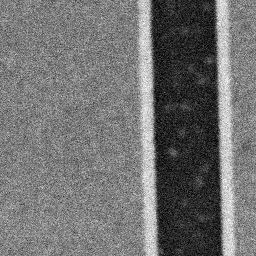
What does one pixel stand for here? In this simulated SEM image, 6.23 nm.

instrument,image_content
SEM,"one or a few lines or trenches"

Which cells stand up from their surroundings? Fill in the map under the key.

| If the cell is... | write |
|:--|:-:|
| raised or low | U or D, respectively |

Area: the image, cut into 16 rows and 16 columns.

UUUUUUUUUDDDDDUU
UUUUUUUUUDDDDDUU
UUUUUUUUUDDDDDUU
UUUUUUUUUDDDDDUU
UUUUUUUUUDDDDDUU
UUUUUUUUUDDDDDUU
UUUUUUUUUDDDDDUU
UUUUUUUUUDDDDDUU
UUUUUUUUUDDDDDUU
UUUUUUUUUDDDDDUU
UUUUUUUUUDDDDDUU
UUUUUUUUUDDDDDUU
UUUUUUUUUDDDDDUU
UUUUUUUUUDDDDDUU
UUUUUUUUUDDDDDUU
UUUUUUUUUDDDDDUU